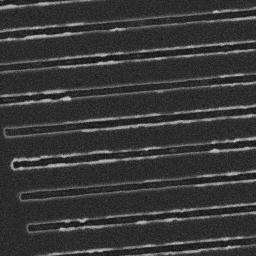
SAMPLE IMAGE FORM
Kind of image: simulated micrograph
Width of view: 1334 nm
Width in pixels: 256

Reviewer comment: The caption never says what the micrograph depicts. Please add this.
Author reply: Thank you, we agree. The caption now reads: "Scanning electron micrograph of parallel lines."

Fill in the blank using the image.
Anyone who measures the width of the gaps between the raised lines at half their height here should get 34.4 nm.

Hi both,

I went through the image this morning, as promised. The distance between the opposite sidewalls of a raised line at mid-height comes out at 134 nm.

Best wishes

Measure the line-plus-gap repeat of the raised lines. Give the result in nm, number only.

169